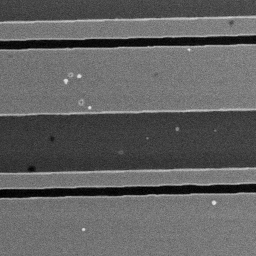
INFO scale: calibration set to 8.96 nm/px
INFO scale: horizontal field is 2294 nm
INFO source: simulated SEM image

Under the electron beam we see lines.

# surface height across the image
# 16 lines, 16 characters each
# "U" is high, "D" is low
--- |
DDDDDDDDDDDDDDDD
UUUUUUUUUUUUUUUU
UUUUUUUUUUUUUUUU
UUUUUUUUUUUUUUUU
UUUUUUUUUUUUUUUU
UUUUUUUUUUUUUUUU
UUUUUUUUUUUUUUUU
DDDDDDDDDDDDDDDD
DDDDDDDDDDDDDDDD
DDDDDDDDDDDDDDDD
DDDDDDDDDDDDDDDD
UUUUUUUUUUUUUUUU
UUUUUUUUUUUUUUUU
UUUUUUUUUUUUUUUU
UUUUUUUUUUUUUUUU
UUUUUUUUUUUUUUUU